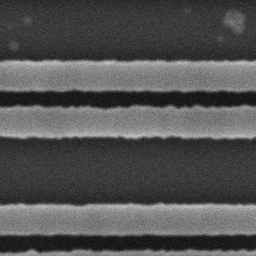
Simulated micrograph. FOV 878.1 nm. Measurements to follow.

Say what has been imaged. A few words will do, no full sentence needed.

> lines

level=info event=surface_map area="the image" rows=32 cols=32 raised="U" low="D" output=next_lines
DDDDDDDDDDDDDDDDDDDDDDDDDDDDDDDD
DDDDDDDDDDDDDDDDDDDDDDDDDDDDDDDD
DDDDDDDDDDDDDDDDDDDDDDDDDDDDDDDD
DDDDDDDDDDDDDDDDDDDDDDDDDDDDDDDD
DDDDDDDDDDDDDDDDDDDDDDDDDDDDDDDD
DDDDDDDDDDDDDDDDDDDDDDDDDDDDDDDD
DDDDDDDDDDDDDDDDDDDDDDDDDDDDDDDD
DDDDDDDDDDDDDDDDDDDDDDDDDDDDDDDD
UUUUUUUUUUUUUUUUUUUUUUUUUUUUUUUU
UUUUUUUUUUUUUUUUUUUUUUUUUUUUUUUU
UUUUUUUUUUUUUUUUUUUUUUUUUUUUUUUU
DDDDDDDDDDDDDDDDDDDDDDDDDDDDDDDD
DDDDDDDDDDDDDDDDDDDDDDDDDDDDDDDD
UUUUUUUUDUUUDDUDUUUUUUDUUUUUUUUU
UUUUUUUUUUUUUUUUUUUUUUUUUUUUUUUU
UUUUUUUUUUUUUUUUUUUUUUUUUUUUUUUU
UUUUUUUUUUUUUUUUUUUUUUUUUUUUUUUU
DDDDDDDDDDDDDDDDDDDDDDDDDDDDDDDD
DDDDDDDDDDDDDDDDDDDDDDDDDDDDDDDD
DDDDDDDDDDDDDDDDDDDDDDDDDDDDDDDD
DDDDDDDDDDDDDDDDDDDDDDDDDDDDDDDD
DDDDDDDDDDDDDDDDDDDDDDDDDDDDDDDD
DDDDDDDDDDDDDDDDDDDDDDDDDDDDDDDD
DDDDDDDDDDDDDDDDDDDDDDDDDDDDDDDD
DDDDDDDDDDDDDDDDDDDDDDDDDDDDDDDD
DDDDDDDDDDDDDDDDDDDDDDDDDDDDDDDD
UUUUUUUUUUUUUUUUUUUUUUUUUUUUUUUU
UUUUUUUUUUUUUUUUUUUUUUUUUUUUUUUU
UUUUUUUUUUUUUUUUUUUUUUUUUUUUUUUU
DDDDDDDDDDDDDDDDDDDDDDDDDDDDDDDD
DDDDDDDDDDDDDDDDDDDDDDDDDDDDDDDD
DDDUDDDDDUUUUUDUUUUDUUUUUUUUUUUU